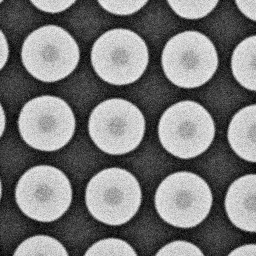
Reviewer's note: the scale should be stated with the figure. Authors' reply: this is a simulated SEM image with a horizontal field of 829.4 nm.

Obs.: an array of small figures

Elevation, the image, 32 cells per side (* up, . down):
....*****....*****...******...**
......*.......***.....****....**
................................
.....**.........................
*...*****....****.....***.......
*..*******..******...******...**
*..*******.*******..*******..***
*..*******.*******..*******..***
...******...******..*******..***
....****....******...*****...***
..............**......***.....**
................................
....****......*.................
...******...*****....****......*
*..******..*******..******...***
*.*******..*******..*******..***
...******..*******..*******..***
...******...******..*******..***
....***.....*****....*****...***
......................**......**
................................
...*****.....***................
..******...******....****.....**
..*******..******...******...***
..*******..*******.*******..****
..*******..******..*******..****
...*****...******...******..****
.....**.....****.....****....***
..............................**
................................
...*****....****.....***........
..******...******...*****....***